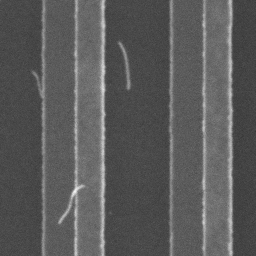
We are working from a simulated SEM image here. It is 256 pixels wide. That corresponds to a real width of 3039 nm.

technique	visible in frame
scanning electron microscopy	lines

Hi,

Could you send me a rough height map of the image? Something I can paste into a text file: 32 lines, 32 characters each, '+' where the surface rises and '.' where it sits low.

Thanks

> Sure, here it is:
.....++++++++........++++++++...
.....++++++++........++++++++...
.....++++++++........++++++++...
.....++++++++........++++++++...
.....++++++++........++++++++...
.....++++++++........++++++++...
.....++++++++........++++++++...
.....++++++++........++++++++...
.....++++++++........++++++++...
.....++++++++........++++++++...
.....++++++++........++++++++...
.....++++++++........++++++++...
.....++++++++........++++++++...
.....++++++++........++++++++...
.....++++++++........++++++++...
.....++++++++........++++++++...
.....++++++++........++++++++...
.....++++++++........++++++++...
.....++++++++........++++++++...
.....++++++++........++++++++...
.....++++++++........++++++++...
.....++++++++........++++++++...
.....++++++++........++++++++...
.....++++++++........++++++++...
.....++++++++........++++++++...
.....++++++++........++++++++...
.....++++++++........++++++++...
.....++++++++........++++++++...
.....++++++++........++++++++...
.....++++++++........++++++++...
.....++++++++........++++++++...
.....++++++++........++++++++...